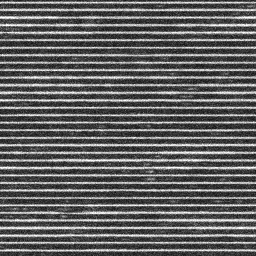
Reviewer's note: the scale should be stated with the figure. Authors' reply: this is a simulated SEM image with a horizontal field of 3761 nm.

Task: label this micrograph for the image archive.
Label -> parallel lines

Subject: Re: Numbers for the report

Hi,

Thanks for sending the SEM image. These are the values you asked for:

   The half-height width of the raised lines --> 23.9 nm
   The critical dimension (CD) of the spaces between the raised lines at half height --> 88.1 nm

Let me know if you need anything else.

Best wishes